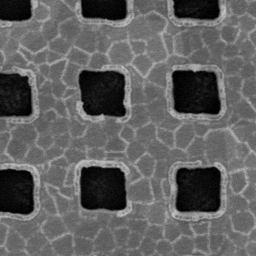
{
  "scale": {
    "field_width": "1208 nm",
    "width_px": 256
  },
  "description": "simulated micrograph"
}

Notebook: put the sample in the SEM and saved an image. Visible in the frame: holes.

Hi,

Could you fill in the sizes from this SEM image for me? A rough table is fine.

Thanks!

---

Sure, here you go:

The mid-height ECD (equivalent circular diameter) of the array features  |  51 pixels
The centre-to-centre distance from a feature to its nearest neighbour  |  444 nm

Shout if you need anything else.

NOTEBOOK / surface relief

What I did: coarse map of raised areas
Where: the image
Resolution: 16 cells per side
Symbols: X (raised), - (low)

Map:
--XXX---XXX---XX
XXXXXXXXXXXXXXXX
XXXXXXXXXXXXXXXX
XXXXXXXXXXXXXXXX
-XXXX--XXXX--XXX
--XXX---XXX---XX
--XXX---XXX---XX
XXXXXXXXXXXXXXXX
XXXXXXXXXXXXXXXX
XXXXXXXXXXXXXXXX
XXXXX--XXXX--XXX
--XXX---XXX---XX
--XXX---XXX---XX
XXXXXXXXXXXXXXXX
XXXXXXXXXXXXXXXX
XXXXXXXXXXXXXXXX